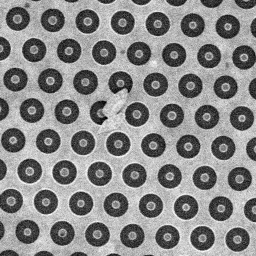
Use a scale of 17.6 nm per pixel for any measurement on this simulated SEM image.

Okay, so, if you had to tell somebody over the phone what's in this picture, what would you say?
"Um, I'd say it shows an array of small figures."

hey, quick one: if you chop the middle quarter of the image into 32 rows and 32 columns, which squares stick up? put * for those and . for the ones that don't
******************.*******...***
****..**************************
***.....****....*****....*****..
**......***......***......***...
**.......**......***......***...
**......***......***......**....
***.....***...**.***......***...
****...*****.********....****...
*******************************.
...*****...******..*************
....***...******.....****....***
....**....*****......***......**
....**....*****......***......**
....**.....****......***......**
...****...******.....***......**
*****************...*****....***
****..**************************
**.....****.....*****...********
**......***.....****.....****...
*.......**.......**......***....
**......**.......**.......**....
**......***......**......***....
***....****.....****.....****...
**********************.*******..
..*****...**********************
...***......***.....*****...****
...***......***......***.....***
...***......**.......**.......**
...***......**.......**.......**
..****......***.....****.....***
********..******....****.....***
********************************